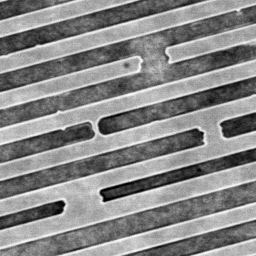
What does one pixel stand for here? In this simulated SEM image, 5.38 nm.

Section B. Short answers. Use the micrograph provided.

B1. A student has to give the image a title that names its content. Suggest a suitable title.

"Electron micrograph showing parallel lines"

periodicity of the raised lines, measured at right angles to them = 184 nm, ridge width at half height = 87.7 nanometres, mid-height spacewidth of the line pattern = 97.5 nanometres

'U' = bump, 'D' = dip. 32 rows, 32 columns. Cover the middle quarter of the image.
DDDDDDDDUUUUUUUUUUUDDDDDDDDDDDDD
DDDDDUUUUUUUUUUUUUUDDDDDDDDDDDDD
DUUUUUUUUUUUUUUUUDDDDDDDDDDDDDDD
UUUUUUUUUUUUUDDDDDDDDDDDDDDDDDDU
UUUUUUUUUDDDDDDDDDDDDDDDDDDUUUUU
UUUUUDDDDDDDDDDDDDDDDDDUUUUUUUUU
UUDDDDDDDDDDDDDDDDDDUUUUUUUUUUUU
DDDDDDDDDDDDDDDDDUUUUUUUUUUUUUUD
DDDDDDDDDDDDUUUUUUUUUUUUUUUUDDDD
DDDDDDDDUUUUUUUUUUUUUUUUDDDDDDDD
DDDDDUUUUUUUUUUUUUUUDDDDDDDDDDDD
DUUUUUUUUUUUUUUUDDDDDDDDDDDDDDDD
UUUUUUUUUUUUUDDDDDDDDDDDDDDDDDUU
UUUUUUUUUDDDDDDDDDDDDDDDDDDUUUUU
UUUUUDUUDDDDDDDDDDDDDDUUUUUUUUUU
UDDDDDDUDDDDDDDDDDDUUUUUUUUUUUUU
DDDDDDDUUDDDDDDUUUUUUUUUUUUUUUUD
DDDDDDDDUDDDUUUUUUUUUUUUUUUDDDDD
DDDDDDDUUUUUUUUUUUUUUUUUDDDDDDDD
DDDDUUUUUUUUUUUUUUUUDDDDDDDDDDDD
DUUUUUUUUUUUUUUUDDDDDDDDDDDDDDDD
UUUUUUUUUUUUDDDDDDDDDDDDDDDDDDUU
UUUUUUUUUDDDDDDDDDDDDDDDDDUUUUUU
UUUUUDDDDDDDDDDDDDDDDDDUUUUUUUUU
UDDDDDDDDDDDDDDDDDDUUUUUUUUUUUUU
DDDDDDDDDDDDDDDUUUUUUUUUUUUUUUUD
DDDDDDDDDDDUUUUUUUUUUUUUUUUDDDDD
DDDDDDDDUUUUUUUUUUUUUUUDDDDDDDDD
DDDDUUUUUUUUUUUUUUUUDDDDDDDDDDDD
UUUUUUUUUUUUUUUUDDDDDDDDDDDDDUUU
UUUUUUUUUUUUDDDDDDDDDDDDDUUUUUUU
UUUUUUUUUDDDDDDDDDDDDDUUUUUUUUUU